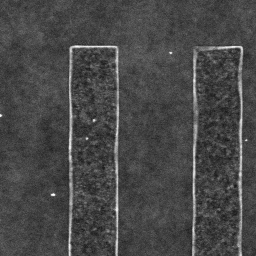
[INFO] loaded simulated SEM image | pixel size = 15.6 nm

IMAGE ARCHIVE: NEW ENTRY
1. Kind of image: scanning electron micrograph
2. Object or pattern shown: wiring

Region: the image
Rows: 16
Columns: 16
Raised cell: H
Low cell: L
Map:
LLLLLLLLLLLLLLLL
LLLLLLLLLLLLLLLL
LLLLLLLLLLLLLLLL
LLLLHHHLLLLLHHHL
LLLLHHHLLLLLHHHL
LLLLHHHLLLLLHHHL
LLLLHHHLLLLLHHHL
LLLLHHHLLLLLHHHL
LLLLHHHLLLLLHHHL
LLLLHHHLLLLLHHHL
LLLLHHHLLLLLHHHL
LLLLHHHLLLLLHHHL
LLLLHHHLLLLLHHHL
LLLLHHHLLLLLHHHL
LLLLHHHLLLLLHHHL
LLLLHHHLLLLLHHHL